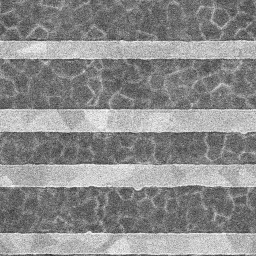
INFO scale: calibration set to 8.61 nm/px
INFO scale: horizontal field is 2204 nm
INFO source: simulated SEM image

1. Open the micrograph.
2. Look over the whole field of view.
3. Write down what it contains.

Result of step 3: one or a few lines or trenches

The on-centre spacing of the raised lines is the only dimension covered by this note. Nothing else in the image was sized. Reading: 556 nm